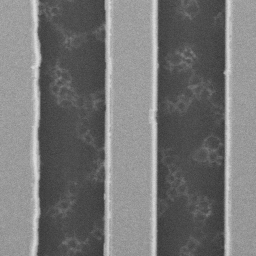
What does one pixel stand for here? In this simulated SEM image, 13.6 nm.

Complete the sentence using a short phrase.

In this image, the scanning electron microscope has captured one or a few lines or trenches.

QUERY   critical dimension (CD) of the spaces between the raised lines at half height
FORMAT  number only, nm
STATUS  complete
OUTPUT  1010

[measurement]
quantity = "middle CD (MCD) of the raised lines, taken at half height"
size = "612 nm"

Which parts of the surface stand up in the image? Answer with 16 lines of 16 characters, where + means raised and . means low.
++.....+++....++
++.....+++....++
++.....+++....++
++.....+++....++
++.....+++....++
++.....+++....++
++.....+++....++
++.....+++....++
++.....+++....++
++.....+++....++
++.....+++....++
++.....+++....++
++.....+++....++
++.....+++....++
++.....+++....++
++.....+++....++